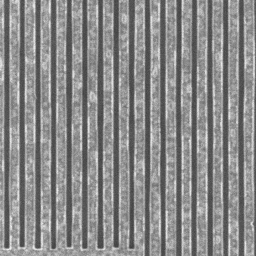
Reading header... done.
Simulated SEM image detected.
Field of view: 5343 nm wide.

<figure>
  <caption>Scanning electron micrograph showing parallel lines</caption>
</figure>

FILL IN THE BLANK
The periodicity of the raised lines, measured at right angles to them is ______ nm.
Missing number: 326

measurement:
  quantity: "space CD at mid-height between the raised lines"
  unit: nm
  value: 125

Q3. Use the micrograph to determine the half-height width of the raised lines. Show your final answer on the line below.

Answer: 193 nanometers